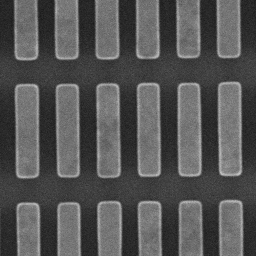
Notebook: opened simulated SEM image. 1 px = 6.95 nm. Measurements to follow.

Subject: groups of lines, slits or small figures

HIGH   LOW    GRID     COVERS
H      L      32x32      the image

LLHHHLLHHHLLHHHLLHHHLLHHHLLHHHLL
LLHHHLLHHHLLHHHLLHHHLLHHHLLHHHLL
LLHHHLLHHHLLHHHLLHHHLLHHHLLHHHLL
LLHHHLLHHHLLHHHLLHHHLLHHHLLHHHLL
LLHHHLLHHHLLHHHLLHHHLLHHHLLHHHLL
LLHHHLLHHHLLHHHLLHHHLLHHHLLHHHLL
LLHHHLLHHHLLHHHLLHHHLLHHHLLHHHLL
LLLLLLLLLLLLLLLLLLLLLLLLLLLLLLLL
LLLLLLLLLLLLLLLLLLLLLLLLLLLLLLLL
LLLLLLLLLLLLLLLLLLLLLLLLLLLLLLLL
LLLLLLLLLLLLLLLLLLLLLLLLLLLLHHLL
LLHHHLLHHHLLHHHLLHHHLLHHHLLHHHLL
LLHHHLLHHHLLHHHLLHHHLLHHHLLHHHLL
LLHHHLLHHHLLHHHLLHHHLLHHHLLHHHLL
LLHHHLLHHHLLHHHLLHHHLLHHHLLHHHLL
LLHHHLLHHHLLHHHLLHHHLLHHHLLHHHLL
LLHHHLLHHHLLHHHLLHHHLLHHHLLHHHLL
LLHHHLLHHHLLHHHLLHHHLLHHHLLHHHLL
LLHHHLLHHHLLHHHLLHHHLLHHHLLHHHLL
LLHHHLLHHHLLHHHLLHHHLLHHHLLHHHLL
LLHHHLLHHHLLHHHLLHHHLLHHHLLHHHLL
LLHHHLLHHHLLHHHLLHHHLLHHHLLHHHLL
LLLLLLLLLLLLLLLLLLLLLLLLLLLLLLLL
LLLLLLLLLLLLLLLLLLLLLLLLLLLLLLLL
LLLLLLLLLLLLLLLLLLLLLLLLLLLLLLLL
LLLHLLLLHHLLHHHLLHHHLLLHHLLLHHLL
LLHHHLLHHHLLHHHLLHHHLLHHHLLHHHLL
LLHHHLLHHHLLHHHLLHHHLLHHHLLHHHLL
LLHHHLLHHHLLHHHLLHHHLLHHHLLHHHLL
LLHHHLLHHHLLHHHLLHHHLLHHHLLHHHLL
LLHHHLLHHHLLHHHLLHHHLLHHHLLHHHLL
LLHHHLLHHHLLHHHLLHHHLLHHHLLHHHLL